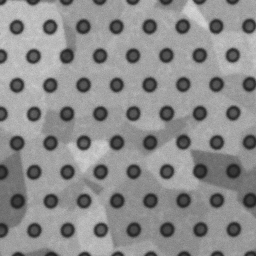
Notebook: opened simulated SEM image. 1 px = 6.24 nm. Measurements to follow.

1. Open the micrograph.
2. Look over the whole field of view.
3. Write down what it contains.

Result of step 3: a regular array of ring-shaped grooves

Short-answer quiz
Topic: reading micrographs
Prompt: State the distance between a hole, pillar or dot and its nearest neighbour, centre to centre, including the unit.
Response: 206 nm